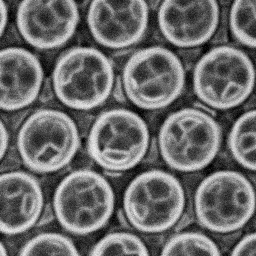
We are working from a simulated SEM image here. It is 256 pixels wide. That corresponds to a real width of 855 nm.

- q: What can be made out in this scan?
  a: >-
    a regular array of raised bodies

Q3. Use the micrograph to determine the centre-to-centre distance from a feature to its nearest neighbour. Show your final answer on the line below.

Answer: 0.236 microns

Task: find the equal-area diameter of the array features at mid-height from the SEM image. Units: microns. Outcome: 0.189